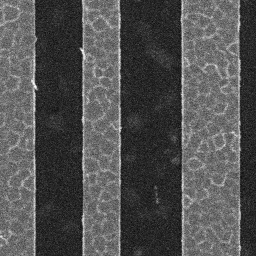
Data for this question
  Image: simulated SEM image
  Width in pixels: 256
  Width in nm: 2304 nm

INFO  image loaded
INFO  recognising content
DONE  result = one or a few lines or trenches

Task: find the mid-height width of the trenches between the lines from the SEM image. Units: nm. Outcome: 437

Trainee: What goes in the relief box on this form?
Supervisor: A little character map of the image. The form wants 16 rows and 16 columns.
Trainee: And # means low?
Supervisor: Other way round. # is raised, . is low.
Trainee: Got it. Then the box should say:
##...##....####.
##...##....####.
##...###...####.
##...###...####.
##...###...####.
##...###...####.
##...###...####.
##...###...####.
##...###...####.
##...###...####.
##...###...####.
##...###...####.
##...##.....###.
##...##....####.
##...##....####.
##...##....####.